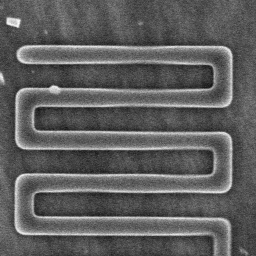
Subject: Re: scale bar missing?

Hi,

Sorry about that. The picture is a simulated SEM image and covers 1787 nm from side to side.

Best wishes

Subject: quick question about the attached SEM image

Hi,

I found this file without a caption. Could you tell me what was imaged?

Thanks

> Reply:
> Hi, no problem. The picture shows groups of lines, slits or small figures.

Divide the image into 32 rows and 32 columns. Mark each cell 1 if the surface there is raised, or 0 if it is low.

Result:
00000000000000000000000000000000
00000000000000000000000000000000
01000000000000000000000000000000
00000000000000000000000000000000
00000000000000000000000000000000
00000000000000000000000000000000
00111111111111111111111111111000
00011111111111111111111111111000
00000000000000000000000000011000
00000000000000000000000000011000
00000000000000000000000000011000
00111111111111111111111111111000
00111111111111111111111111111000
00111000000000000000000000000000
00110000000000000000000000000000
00110000000000000000000000000000
00111111100000000000000000000000
00111111111111111111111111111000
00011111111111111111110001111000
00000000000000000000000000011000
00000000000000000000000000011000
00000000000000000000000000011000
00111111111111111111111111111000
00111111111111111111111111111000
00110000000000000000000000000000
00110000000000000000000000000000
00110000000000000000000000000000
00111111111111111111111111110000
00111111111111111111111111111000
00000000000000000000000000111000
00000000000000000000000000011000
00000000000000000000000000011000